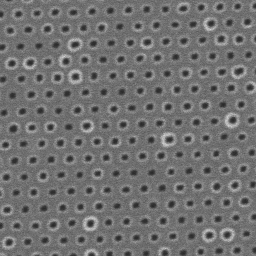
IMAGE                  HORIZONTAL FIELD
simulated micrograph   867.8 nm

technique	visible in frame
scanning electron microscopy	a regular array of holes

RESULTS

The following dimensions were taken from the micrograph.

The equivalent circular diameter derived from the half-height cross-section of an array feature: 23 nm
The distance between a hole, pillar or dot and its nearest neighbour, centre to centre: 0.0608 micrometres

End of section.